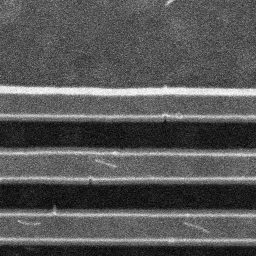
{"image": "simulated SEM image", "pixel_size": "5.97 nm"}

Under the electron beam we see one or a few lines or trenches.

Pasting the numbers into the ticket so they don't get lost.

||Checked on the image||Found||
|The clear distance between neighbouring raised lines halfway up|192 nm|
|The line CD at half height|177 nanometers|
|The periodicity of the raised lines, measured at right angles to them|366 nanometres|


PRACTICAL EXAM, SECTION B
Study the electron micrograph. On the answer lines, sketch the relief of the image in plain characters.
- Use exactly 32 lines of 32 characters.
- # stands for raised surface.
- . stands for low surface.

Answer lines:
................................
................................
................................
................................
................................
................................
................................
................................
................................
................................
................................
#############....##########.....
################################
################################
################################
................................
................................
................................
................................
################################
################################
################################
################################
................................
................................
................................
......#.........................
################################
################################
################################
................................
................................